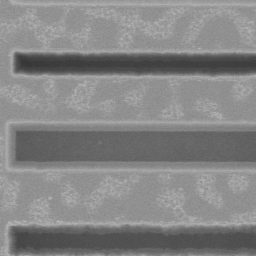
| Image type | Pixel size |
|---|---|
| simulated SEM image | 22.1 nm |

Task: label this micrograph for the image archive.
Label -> one or a few lines or trenches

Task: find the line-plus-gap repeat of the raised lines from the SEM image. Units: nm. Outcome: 1970